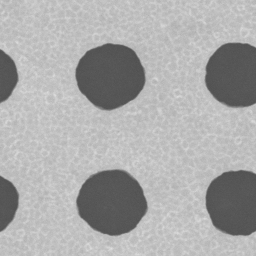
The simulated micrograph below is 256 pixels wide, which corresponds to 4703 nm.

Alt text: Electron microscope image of holes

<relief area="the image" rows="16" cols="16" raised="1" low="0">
1111111111111111
1111111111111111
1111111111111111
0111100001111000
0111100001111000
0111100001111000
1111110011111100
1111111111111111
1111111111111111
1111111111111111
1111111111111111
0111100001111000
0111100001111000
0111100001111000
1111110011111100
1111111111111111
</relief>